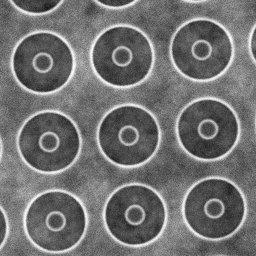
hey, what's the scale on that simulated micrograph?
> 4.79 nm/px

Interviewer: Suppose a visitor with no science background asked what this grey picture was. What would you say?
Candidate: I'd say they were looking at an array of small figures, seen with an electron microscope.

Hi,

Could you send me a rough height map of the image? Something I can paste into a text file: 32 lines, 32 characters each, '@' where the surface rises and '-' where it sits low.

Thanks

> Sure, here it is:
@@-----@@@@@@---@@@@@@@@@@@@@@@@
@@@---@@@@@@@@@@@@@@@@@@@@@@@@@@
@@@@@@@@@@@@@@@@@@@@@@@@@@@@@@@@
@@@@@@@@@@@@@@---@@@@@@-----@@@@
@@@@---@@@@@@-----@@@@-------@@-
@@------@@@@-------@@@--@@---@@-
@@-------@@@--@@---@@---@@---@@-
@@--@@---@@@--@@---@@@-------@@@
@@--@@---@@@-------@@@------@@@@
@@-------@@@------@@@@@----@@@@@
@@@-----@@@@@@---@@@@@@@@@@@@@@@
@@@@@-@@@@@@@@@@@@@@@@@@@@@@@@@@
@@@@@@@@@@@@@@@@@@@@@@@@@--@@@@@
@@@@@@@@@@@@@@@---@@@@@------@@@
@@@@----@@@@@------@@@@------@@@
@@@------@@@@-------@@---@@---@@
@@@-------@@---@@---@@---@@---@@
@@---@@---@@---@@---@@@-------@@
@@---@@---@@@-------@@@------@@@
@@@-------@@@------@@@@@----@@@@
@@@@-----@@@@@@--@@@@@@@@@@@@@@@
@@@@@@@@@@@@@@@@@@@@@@@@@@@@@@@@
@@@@@@@@@@@@@@@@@@@@@@@@@@--@@@@
@@@@@@@@@@@@@@@----@@@@@------@@
@@@@@----@@@@@------@@@-------@@
@@@@------@@@-------@@@---@@---@
@@@--------@@---@@---@@---@@---@
-@@---@@---@@---@@---@@-------@@
-@@---@@---@@-------@@@@------@@
-@@@------@@@@------@@@@@---@@@@
@@@@@----@@@@@@@--@@@@@@@@@@@@@@
@@@@@@@@@@@@@@@@@@@@@@@@@@@@@@@@